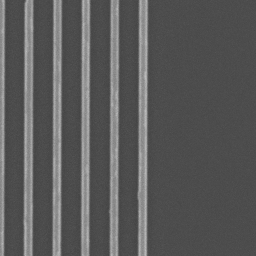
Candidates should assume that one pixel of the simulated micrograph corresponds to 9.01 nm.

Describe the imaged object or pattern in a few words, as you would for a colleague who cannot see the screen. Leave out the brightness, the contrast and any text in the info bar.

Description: parallel lines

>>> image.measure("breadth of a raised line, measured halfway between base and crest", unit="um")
0.0586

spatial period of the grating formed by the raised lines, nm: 258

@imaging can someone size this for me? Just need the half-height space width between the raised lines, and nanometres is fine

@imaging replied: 199